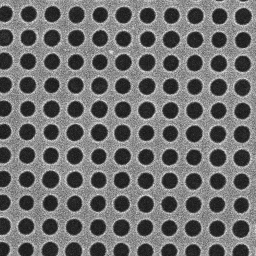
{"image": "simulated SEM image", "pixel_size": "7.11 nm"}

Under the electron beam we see a regular array of holes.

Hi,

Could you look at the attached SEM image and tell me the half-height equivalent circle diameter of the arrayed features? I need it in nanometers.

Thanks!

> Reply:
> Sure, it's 116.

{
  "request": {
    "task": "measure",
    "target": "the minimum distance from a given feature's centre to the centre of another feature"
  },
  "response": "167 nanometers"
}